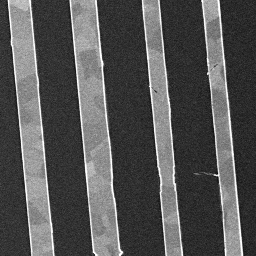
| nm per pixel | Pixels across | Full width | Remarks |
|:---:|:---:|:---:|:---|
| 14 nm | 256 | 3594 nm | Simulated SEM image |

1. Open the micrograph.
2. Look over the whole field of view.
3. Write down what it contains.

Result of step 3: one or a few lines or trenches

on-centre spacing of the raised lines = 891 nanometres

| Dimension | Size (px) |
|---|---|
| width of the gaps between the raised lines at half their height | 43.4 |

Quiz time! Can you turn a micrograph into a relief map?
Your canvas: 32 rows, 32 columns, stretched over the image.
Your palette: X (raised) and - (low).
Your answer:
-XXX-----XXX------XX-----XX-----
-XXX-----XXX------XX-----XX-----
-XXX-----XXX------XX------XX----
-XXX-----XXX------XX------XX----
-XXX-----XXX------XX------XX----
-XXX-----XXX------XX------XX----
--XX-----XXXX-----XX------XX----
--XX------XXX-----XXX-----XX----
--XXX-----XXX------XX-----XX----
--XXX-----XXX------XX-----XX----
--XXX-----XXX------XX-----XX----
--XXX-----XXX------XX-----XX----
--XXX-----XXX------XX-----XX----
--XXX-----XXX------XX------XX---
--XXX-----XXX------XX------XX---
---XX-----XXX------XX------XX---
---XX-----XXX------XX------XX---
---XX-----XXXX-----XXX-----XX---
---XX------XXX------XX-----XX---
---XXX-----XXX------XX-----XX---
---XXX-----XXX------XX-----XX---
---XXX-----XXX------XX-----XX---
---XXX-----XXX------XX-----XX---
---XXX-----XXX------XX------X---
---XXX-----XXX------XX------XX--
---XXX-----XXX------XX------XX--
---XXX-----XXXX-----XX------XX--
----XX-----XXXX-----XX------XX--
----XX-----XXXX-----XX------XX--
----XXX----XXXX------XX-----XX--
----XXX-----XXX------XX-----XX--
----XXX-----XXX------XX-----XX--